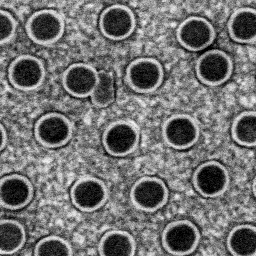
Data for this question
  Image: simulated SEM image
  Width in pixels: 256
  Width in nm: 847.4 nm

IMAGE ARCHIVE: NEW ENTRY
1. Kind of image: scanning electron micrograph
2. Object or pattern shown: a regular array of raised bodies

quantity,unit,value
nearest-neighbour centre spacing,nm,186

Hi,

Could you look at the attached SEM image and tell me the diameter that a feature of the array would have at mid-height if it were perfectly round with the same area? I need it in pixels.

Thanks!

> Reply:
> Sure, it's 33.1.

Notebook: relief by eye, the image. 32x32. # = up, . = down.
................................
.....##......###..............##
##..####.....####.......#....###
##..####.....####.....####...###
#...###......###......#####..###
.......................###......
..........................#.....
..###....................####...
.####....##.....####.....####...
.####...####....####.....###....
..###...######..####............
.........#####..................
............##..................
................................
......#.......................##
.....####.....##.....###.....###
.....####....####....####....###
.....###.....####....###......##
.............####...............
................................
..........................#.....
.........................###....
###.......##......##....####....
####.....####....####....###....
####.....####...#####...........
###......####....###............
................................
................................
###..................###......##
###..........###.....####....###
###..###.....####....###.....###
##..#####....####....###.....###